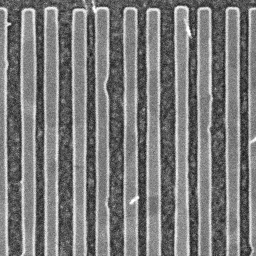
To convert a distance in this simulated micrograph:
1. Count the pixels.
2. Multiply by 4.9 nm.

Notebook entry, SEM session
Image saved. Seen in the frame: parallel lines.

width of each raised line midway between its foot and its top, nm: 56.9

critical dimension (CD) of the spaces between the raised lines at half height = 0.0686 micrometres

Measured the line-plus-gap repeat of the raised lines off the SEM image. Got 125 nm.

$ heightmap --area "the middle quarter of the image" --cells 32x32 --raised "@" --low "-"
--@@@---@@@----@@@---@@@----@@@-
--@@@---@@@----@@@---@@@----@@@-
--@@@---@@@----@@@---@@@----@@@-
--@@@---@@@----@@@---@@@----@@@-
--@@@@--@@@----@@@---@@@----@@@-
--@@@@--@@-----@@@---@@@----@@@-
--@@@---@@-----@@@---@@@----@@@-
--@@@---@@@----@@@---@@@----@@@-
--@@@---@@@----@@@---@@@----@@@-
--@@@---@@@----@@@---@@@----@@@-
--@@@---@@@----@@@---@@@----@@@-
--@@@---@@@----@@@---@@@----@@@-
--@@@---@@@----@@@---@@@----@@@-
--@@@---@@@----@@@---@@@----@@@-
--@@@---@@@----@@@---@@@----@@@-
--@@@---@@@----@@@---@@@----@@@-
--@@@---@@@----@@@---@@@----@@@-
--@@@---@@@----@@@---@@@----@@@-
---@@---@@@----@@@---@@@----@@@-
---@@---@@@----@@@---@@@----@@@-
---@@---@@@----@@@---@@@----@@@-
---@@---@@@----@@@---@@@----@@@-
---@@---@@@----@@@---@@@----@@@-
---@@---@@@----@@@---@@@----@@@-
---@@---@@@----@@@---@@@----@@@-
---@@---@@@----@@@---@@@----@@@-
---@@---@@@----@@@---@@@----@@@-
---@@---@@@----@@@---@@@----@@@-
---@@---@@@----@@@---@@@----@@@-
---@@---@@@----@@@---@@@----@@@-
---@@---@@@----@@@---@@@----@@@-
---@@---@@@----@@@---@@@----@@@-